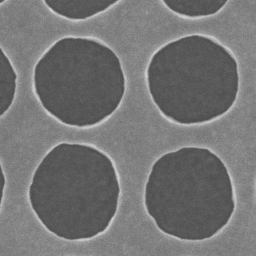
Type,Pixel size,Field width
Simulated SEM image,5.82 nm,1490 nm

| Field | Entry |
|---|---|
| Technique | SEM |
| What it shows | holes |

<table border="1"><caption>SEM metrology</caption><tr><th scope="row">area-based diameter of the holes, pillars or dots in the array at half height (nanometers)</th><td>527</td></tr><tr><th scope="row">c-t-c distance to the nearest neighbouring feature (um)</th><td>0.651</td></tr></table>